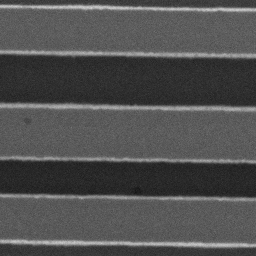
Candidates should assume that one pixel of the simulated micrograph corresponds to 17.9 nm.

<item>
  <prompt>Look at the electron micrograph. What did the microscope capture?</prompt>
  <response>lines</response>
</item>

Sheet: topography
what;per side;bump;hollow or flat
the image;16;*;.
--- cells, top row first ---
******..........
****************
****************
................
................
................
................
****************
****************
****************
................
................
****************
****************
****************
................